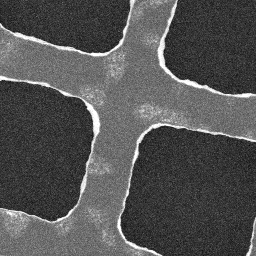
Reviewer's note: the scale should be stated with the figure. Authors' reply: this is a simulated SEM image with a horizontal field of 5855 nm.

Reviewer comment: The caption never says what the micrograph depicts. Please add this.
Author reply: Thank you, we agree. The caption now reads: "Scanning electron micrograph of holes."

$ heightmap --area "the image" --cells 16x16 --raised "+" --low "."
........+++.....
........+++.....
++......++......
++++++++++......
+++++++++++.....
...++++++++++...
.....+++++++++++
......++++++++++
......+++.....++
......+++.......
.....+++........
.....+++........
.....+++........
++..++++........
++++++++........
+++++++++.......